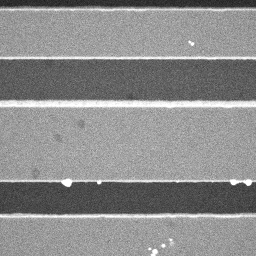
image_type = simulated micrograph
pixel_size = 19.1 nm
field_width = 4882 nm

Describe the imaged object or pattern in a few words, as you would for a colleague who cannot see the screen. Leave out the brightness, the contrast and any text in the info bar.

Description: lines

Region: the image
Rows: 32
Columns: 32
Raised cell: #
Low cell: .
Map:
................................
################################
################################
################################
################################
################################
################################
................................
................................
................................
................................
................................
................................
################################
################################
################################
################################
################################
################################
################################
################################
################################
################################
................................
................................
................................
................................
################################
################################
################################
################################
################################